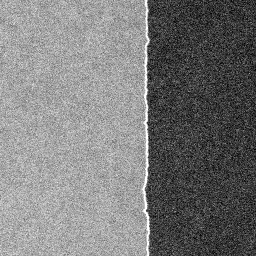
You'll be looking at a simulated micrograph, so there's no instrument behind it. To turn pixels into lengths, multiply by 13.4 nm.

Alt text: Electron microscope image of one or a few lines or trenches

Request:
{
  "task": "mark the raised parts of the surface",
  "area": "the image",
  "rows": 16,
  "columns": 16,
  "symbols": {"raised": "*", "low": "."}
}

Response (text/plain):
.........*******
.........*******
.........*******
.........*******
.........*******
.........*******
.........*******
.........*******
.........*******
.........*******
.........*******
.........*******
.........*******
.........*******
.........*******
.........*******